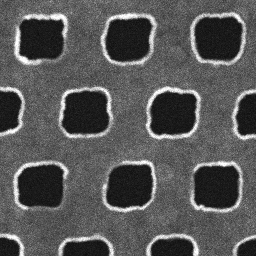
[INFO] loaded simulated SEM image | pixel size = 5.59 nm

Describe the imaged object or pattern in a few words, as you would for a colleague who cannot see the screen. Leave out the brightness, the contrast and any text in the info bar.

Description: a regular array of holes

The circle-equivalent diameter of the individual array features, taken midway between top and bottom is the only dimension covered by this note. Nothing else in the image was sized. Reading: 264 nm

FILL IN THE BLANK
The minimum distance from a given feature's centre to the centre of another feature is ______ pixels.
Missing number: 85.1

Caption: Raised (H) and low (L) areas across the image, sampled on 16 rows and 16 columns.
HHHHHHHHHHHHHHHH
HLLLHHHLLHHHLLLH
HLLLHHHLLHHHLLLH
HHLLHHHLLHHHHLLH
HHHHHHHHHHHHHHHH
HHHHHHHHHHHHHHHH
LHHHLLLHHHLLHHHL
LHHHLLLHHLLLHHHL
HHHHHHHHHHHHHHHH
HHHHHHHHHHHHHHHH
HHLLHHHLLHHHHLLH
HLLLHHHLLLHHLLLH
HLLLHHHLLHHHLLLH
HHHHHHHHHHHHHHHH
HHHHHHHHHHHHHHHH
LHHHLLLHHLLLHHHL